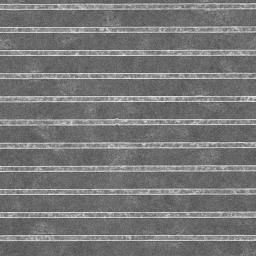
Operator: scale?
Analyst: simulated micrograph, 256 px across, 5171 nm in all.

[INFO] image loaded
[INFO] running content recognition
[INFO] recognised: parallel lines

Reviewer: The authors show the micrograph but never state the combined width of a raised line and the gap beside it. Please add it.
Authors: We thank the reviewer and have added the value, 468 nm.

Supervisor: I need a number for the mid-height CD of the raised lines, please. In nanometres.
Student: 114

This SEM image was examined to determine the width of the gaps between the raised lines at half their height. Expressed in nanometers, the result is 354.